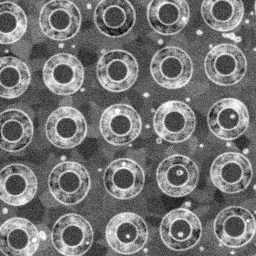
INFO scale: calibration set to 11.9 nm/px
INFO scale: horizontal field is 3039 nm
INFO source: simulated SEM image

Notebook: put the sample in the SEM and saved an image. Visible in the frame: an array of small figures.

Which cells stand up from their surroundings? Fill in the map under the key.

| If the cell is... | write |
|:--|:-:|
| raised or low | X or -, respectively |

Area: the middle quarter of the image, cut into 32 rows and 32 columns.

X---XXXX---XXXXX--XXXX--XXXXXX--
XX---XXX---XXXXX--XXXX--XXXXXX--
XX---XXX---XXXXX--XXXX---XXXX---
XX---XXXX--XXXX---XXXXX---XX---X
XX--XXXXX--------XXXXXXX-------X
----XXXXXX-------XXXXXXXX----XXX
---XXXXXXXX----XXXXXXXXXXXXXXXXX
-XXXXXXXXXXXXXXXXXXXXXXXXXXXXXXX
XXXXXXXXXXXXXXXXXXXXXXXXXXXXXXXX
XXXXXXXXXXXXXXXXXXXXXXXXXX--XXXX
XXXXXXXXXXXX----XXXXXXXX-------X
---XXXXXXXX------XXXXXX---------
----XXXXXX--------XXXXX---XXXX--
XX---XXXX---XXXX---XXXX--XXXXX--
XXX--XXXX---XXXXX--XXX---XXXXX--
XXX--XXXX---XXXXX--XXXX--XXXXX--
XXX---XXX---XXXX---XXXX---XXXX--
XXX--XXXXX---XXX--XXXXXX--------
XX---XXXXX--------XXXXXXX------X
----XXXXXXX-----XXXXXXX-XXX--XXX
--XXXXXXXXXXXXXXXXXXXXXXXXXXXXXX
XXXXXXXXXXXXXXXXXXXXXXXXXXXXXXXX
XXXXXXXXXXXXXXXXXXXXXXXXXXXXXXXX
XXXXXXXXXXXXXXXXXXXXXXXXXX-----X
XXXXXXXXXXXX------XXXXXXX-------
----XXXXXXX--------XXXXX---XXX--
-----XXXXXX--XXX---XXXX---XXXXX-
XXX---XXXX--XXXXX---XXX---XXXXX-
XXXX--XXXX--XXXXXX--XXX---XXXXX-
XXXX--XXXX--XXXXXX--XXXX--XXXXX-
XXXX--XXXX---XXXX---XXXX---X----
XXX---XXXXX--------XXXXXX-------